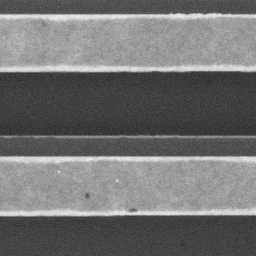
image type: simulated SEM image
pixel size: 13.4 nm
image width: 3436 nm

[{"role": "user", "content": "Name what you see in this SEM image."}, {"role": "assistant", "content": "lines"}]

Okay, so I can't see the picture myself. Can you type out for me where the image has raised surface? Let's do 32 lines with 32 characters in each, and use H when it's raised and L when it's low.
HHHHHHHHHHHHHHHHHHHHHHHHHHHHHHHH
HHHHHHHHHHHHHHHHHHHHHHHHHHHHHHHH
HHHHHHHHHHHHHHHHHHHHHHHHHHHHHHHH
HHHHHHHHHHHHHHHHHHHHHHHHHHHHHHHH
HHHHHHHHHHHHHHHHHHHHHHHHHHHHHHHH
HHHHHHHHHHHHHHHHHHHHHHHHHHHHHHHH
HHHHHHHHHHHHHHHHHHHHHHHHHHHHHHHH
HHHHHHHHHHHHHHHHHHHHHHHHHHHHHHHH
HHHHHHHHHHHHHHHHHHHHHHHHHHHHHHHH
LLLLLLLLLLLLLLLLLLLLLLLLLLLLLLLL
LLLLLLLLLLLLLLLLLLLLLLLLLLLLLLLL
LLLLLLLLLLLLLLLLLLLLLLLLLLLLLLLL
LLLLLLLLLLLLLLLLLLLLLLLLLLLLLLLL
LLLLLLLLLLLLLLLLLLLLLLLLLLLLLLLL
LLLLLLLLLLLLLLLLLLLLLLLLLLLLLLLL
LLLLLLLLLLLLLLLLLLLLLLLLLLLLLLLL
LLLLLLLLLLLLLLLLLLLLLLLLLLLLLLLL
HHHHHHHHHHHHHHHHHHHHHHHHHHHHHHHH
HHHHHHHHHHHHHHHHHHHHHHHHHHHHHHHH
HHHHHHHHHHHHHHHHHHHHHHHHHHHHHHHH
HHHHHHHHHHHHHHHHHHHHHHHHHHHHHHHH
HHHHHHHHHHHHHHHHHHHHHHHHHHHHHHHH
HHHHHHHHHHHHHHHHHHHHHHHHHHHHHHHH
HHHHHHHHHHHHHHHHHHHHHHHHHHHHHHHH
HHHHHHHHHHHHHHHHHHHHHHHHHHHHHHHH
HHHHHHHHHHHHHHHHHHHHHHHHHHHHHHHH
HHHHHHHHHHHHHHHHHHHHHHHHHHHHHHHH
LLLLLLLLLLLLLLLLLLLLLLLLLLLLLLLL
LLLLLLLLLLLLLLLLLLLLLLLLLLLLLLLL
LLLLLLLLLLLLLLLLLLLLLLLLLLLLLLLL
LLLLLLLLLLLLLLLLLLLLLLLLLLLLLLLL
LLLLLLLLLLLLLLLLLLLLLLLLLLLLLLLL